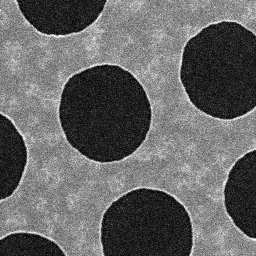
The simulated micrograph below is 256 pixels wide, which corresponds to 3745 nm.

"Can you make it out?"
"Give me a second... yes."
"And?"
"holes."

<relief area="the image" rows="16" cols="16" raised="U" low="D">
UDDDDDUUUUUUUUUU
UUDDDDUUUUUUUDDU
UUUUUUUUUUUUDDDD
UUUUUUUUUUUDDDDD
UUUUUDDDUUUDDDDD
UUUUDDDDDUUDDDDD
UUUUDDDDDUUUDDDD
DUUUDDDDDUUUUUUU
DUUUDDDDDUUUUUUU
DDUUUDDDUUUUUUUU
DDUUUUUUUUUUUUDD
DUUUUUUUUUUUUUDD
UUUUUUUDDDDUUUDD
UUUUUUDDDDDDUUDD
UUUUUUDDDDDDUUUD
DDDDUUDDDDDDUUUU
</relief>